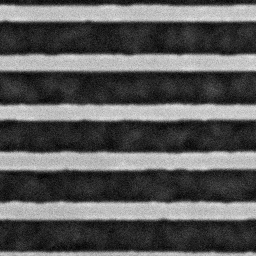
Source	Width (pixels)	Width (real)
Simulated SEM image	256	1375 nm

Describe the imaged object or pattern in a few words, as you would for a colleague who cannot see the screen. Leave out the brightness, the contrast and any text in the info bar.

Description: lines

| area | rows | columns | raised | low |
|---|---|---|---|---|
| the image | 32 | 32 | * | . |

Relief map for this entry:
................................
********************************
********************************
................................
................................
................................
................................
********************************
********************************
................................
................................
................................
................................
********************************
********************************
................................
................................
................................
................................
********************************
********************************
................................
................................
................................
................................
********************************
********************************
................................
................................
................................
................................
................*...............